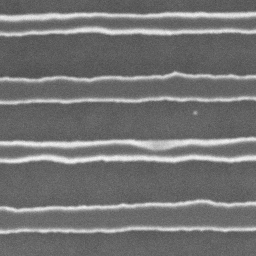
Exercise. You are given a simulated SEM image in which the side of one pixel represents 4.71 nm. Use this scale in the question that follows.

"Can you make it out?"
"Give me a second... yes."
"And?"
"lines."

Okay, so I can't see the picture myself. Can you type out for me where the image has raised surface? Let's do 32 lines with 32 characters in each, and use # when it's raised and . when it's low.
................................
................................
################################
################################
................................
................................
................................
................................
................................
....................#######.##..
################################
################################
###################...##.####...
................................
................................
................................
................................
.............................###
################################
################################
................................
................................
................................
................................
................................
..................##############
################################
################################
################################
................................
................................
................................